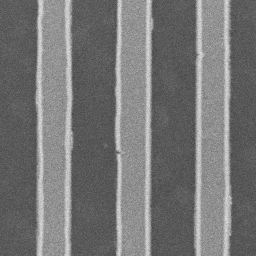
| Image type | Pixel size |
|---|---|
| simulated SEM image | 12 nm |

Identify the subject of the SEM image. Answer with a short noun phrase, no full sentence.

one or a few lines or trenches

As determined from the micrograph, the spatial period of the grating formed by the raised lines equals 950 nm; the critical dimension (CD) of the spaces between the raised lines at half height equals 616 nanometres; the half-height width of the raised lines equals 330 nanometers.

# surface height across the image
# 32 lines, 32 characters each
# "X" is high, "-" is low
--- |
-----XXX-------XXX-------XXX----
-----XXX-------XXX-------XXX----
-----XXX-------XXX-------XXX----
-----XXX-------XXX-------XXX----
-----XXX-------XXX-------XXX----
-----XXX-------XXX-------XXX----
-----XXX-------XXX-------XXX----
-----XXXX------XXX-------XXX----
-----XXXX------XXX-------XXX----
-----XXXX------XXX-------XXX----
-----XXXX------XXX-------XXX----
-----XXXX------XXX-------XXX----
-----XXXX------XXX-------XXX----
-----XXXX------XXX-------XXX----
-----XXXX------XXX-------XXX----
-----XXX-------XXX-------XXX----
-----XXXX------XXX-------XXX----
-----XXX-------XXX-------XXX----
-----XXX-------XXX-------XXX----
-----XXX-------XXX-------XXX----
-----XXXX------XXX-------XXX----
-----XXX-------XXX-------XXX----
-----XXX-------XXX-------XXX----
-----XXX-------XXX-------XXX----
-----XXX-------XXX-------XXX----
-----XXX-------XXX-------XXX----
-----XXX-------XXX-------XXX----
-----XXX-------XXX-------XXX----
-----XXX-------XXX-------XXX----
-----XXX-------XXX-------XXX----
-----XXX-------XXX-------XXX----
-----XXX-------XXX-------XXX----